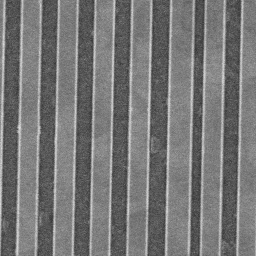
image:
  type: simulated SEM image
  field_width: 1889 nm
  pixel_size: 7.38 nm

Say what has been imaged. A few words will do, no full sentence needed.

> parallel lines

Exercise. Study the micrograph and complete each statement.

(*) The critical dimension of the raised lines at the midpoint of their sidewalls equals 138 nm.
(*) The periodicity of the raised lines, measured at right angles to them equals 0.271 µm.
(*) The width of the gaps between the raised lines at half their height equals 0.131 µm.